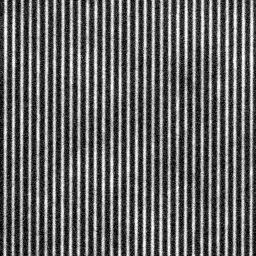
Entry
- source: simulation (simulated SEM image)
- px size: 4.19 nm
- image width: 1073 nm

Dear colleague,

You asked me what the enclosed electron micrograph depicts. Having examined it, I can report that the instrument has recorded parallel lines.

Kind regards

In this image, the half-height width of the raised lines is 8.4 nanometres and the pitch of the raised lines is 34.4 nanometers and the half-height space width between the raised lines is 0.0267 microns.